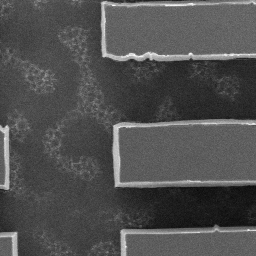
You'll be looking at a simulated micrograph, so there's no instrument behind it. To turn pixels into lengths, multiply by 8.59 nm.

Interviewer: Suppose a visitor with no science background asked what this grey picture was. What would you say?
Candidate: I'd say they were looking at one or a few lines or trenches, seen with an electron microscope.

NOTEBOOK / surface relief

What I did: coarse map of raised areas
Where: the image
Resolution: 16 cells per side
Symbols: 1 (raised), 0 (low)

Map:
0000000111111111
0000001111111111
0000000111111111
0000000111111111
0000000000000000
0000000000000000
0000000000000000
0000000000000000
0000000111111111
0000000111111111
0000000111111111
0000000011110010
0000000000000000
0000000000000000
0000000011111111
1000000011111111